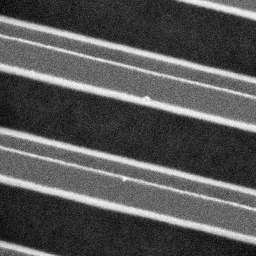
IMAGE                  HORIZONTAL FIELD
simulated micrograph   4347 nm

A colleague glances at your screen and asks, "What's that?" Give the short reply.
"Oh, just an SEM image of lines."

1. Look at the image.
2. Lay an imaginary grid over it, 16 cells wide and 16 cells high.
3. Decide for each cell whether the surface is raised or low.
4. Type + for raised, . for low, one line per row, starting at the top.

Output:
..............++
+...............
+++++...........
+++++++++.......
.++++++++++++...
......++++++++++
..........++++++
..............++
+...............
+++++...........
+++++++++.......
..++++++++++++..
......++++++++++
..........++++++
..............++
+...............